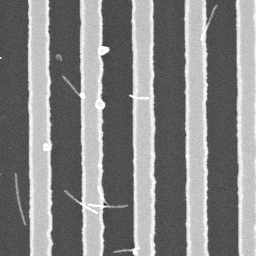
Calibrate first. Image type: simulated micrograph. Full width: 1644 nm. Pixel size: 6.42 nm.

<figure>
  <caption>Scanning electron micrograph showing lines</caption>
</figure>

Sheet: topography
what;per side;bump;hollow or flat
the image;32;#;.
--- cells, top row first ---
....##....###....##....###....##
....##....###....##....###....##
....##....###...###....###....##
....##....###....##....###....##
....##....###....##....###....##
....##....###....##....###....##
....##....###....##....###....##
....##....###....##....###....##
....##....###....##....###....##
....##....###....##....###....##
....##....###....##....###....##
....##....###....##....###....##
....##....###....##....###....##
....##....###....##....###....##
....##....###....##....###....##
....##....###....##....###....##
....##....###....##....###....##
....##....###....##....###....##
....##....###....##....###....##
....##....###....##....###....##
....##....###....##....###....##
....##....###....##....###....##
....##....###....##....###....##
....##....###....##....###....##
....##....###....##....###....##
....##....###....##....###....##
....##....###....##....###....##
....##....###....##....###....##
....##....###....##....###....##
....##....###....##....###....##
....##....###....##....###....##
....##....###....##....###....##